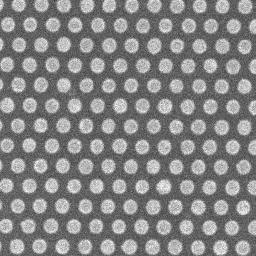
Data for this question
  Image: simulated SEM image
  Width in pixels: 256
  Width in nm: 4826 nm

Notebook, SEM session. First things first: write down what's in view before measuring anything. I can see a regular array of raised bodies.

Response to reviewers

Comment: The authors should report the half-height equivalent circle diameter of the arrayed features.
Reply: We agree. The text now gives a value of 0.255 um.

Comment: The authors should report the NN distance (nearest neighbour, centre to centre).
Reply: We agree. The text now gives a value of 422 nm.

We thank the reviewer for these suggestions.